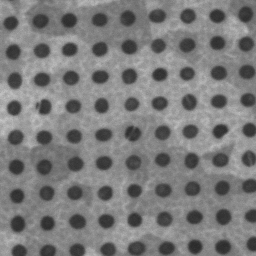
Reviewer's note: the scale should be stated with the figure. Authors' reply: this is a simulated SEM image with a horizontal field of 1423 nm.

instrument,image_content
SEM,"a regular array of holes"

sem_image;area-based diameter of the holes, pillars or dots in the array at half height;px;15.9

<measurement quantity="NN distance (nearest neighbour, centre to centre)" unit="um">0.156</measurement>